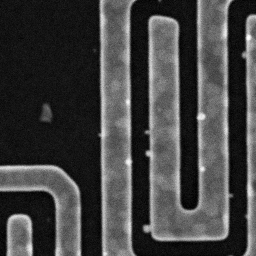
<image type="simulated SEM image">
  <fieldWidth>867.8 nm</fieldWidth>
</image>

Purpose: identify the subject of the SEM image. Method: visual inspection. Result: wiring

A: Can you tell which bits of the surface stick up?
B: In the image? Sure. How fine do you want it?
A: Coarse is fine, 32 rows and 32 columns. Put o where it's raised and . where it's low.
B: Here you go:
.............oooo........oooo...
.............ooo.........ooo....
.............ooo...ooo...ooo...o
.............ooo...ooo...ooo...o
.............ooo...ooo...ooo...o
.............ooo...ooo...ooo...o
.............ooo...ooo...ooo...o
.............ooo...ooo...ooo...o
.............ooo...ooo...ooo...o
.............ooo...ooo...ooo...o
.............ooo...ooo...ooo...o
.............ooo...ooo...ooo...o
.............ooo...ooo...ooo...o
.............ooo...ooo...ooo...o
.............ooo...ooo...ooo...o
.............ooo...ooo...ooo...o
.............ooo...ooo...ooo...o
.............ooo...ooo...ooo...o
.............ooo...ooo...ooo...o
.............ooo...ooo...oooo..o
.............ooo...ooo...oooo..o
oooooooo.....ooo...ooo...oooo..o
ooooooooo....ooo...ooo...oooo..o
oooooooooo...ooo...ooo...oooo..o
.......ooo...ooo...ooo...oooo..o
.......ooo...ooo...oooo..oooo..o
.......ooo...ooo...oooooooooo..o
.ooo...ooo...ooo...oooooooooo..o
.ooo...ooo...ooo...oooooooooo..o
.ooo...ooo...ooo...ooooooooo...o
.ooo...ooo...ooo...............o
.ooo...ooo...oooo..............o